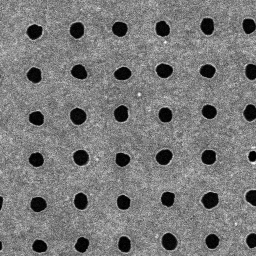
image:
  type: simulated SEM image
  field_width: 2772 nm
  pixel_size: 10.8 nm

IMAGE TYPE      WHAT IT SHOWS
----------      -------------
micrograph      a regular array of holes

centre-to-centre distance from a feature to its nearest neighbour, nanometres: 453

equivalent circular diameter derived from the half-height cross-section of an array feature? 163 nm